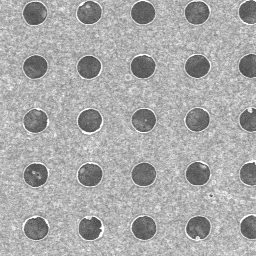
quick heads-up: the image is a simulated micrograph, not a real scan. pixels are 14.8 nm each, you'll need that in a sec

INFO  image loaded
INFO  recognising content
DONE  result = a regular array of holes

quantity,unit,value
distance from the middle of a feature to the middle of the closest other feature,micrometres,0.794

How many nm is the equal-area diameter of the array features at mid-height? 360